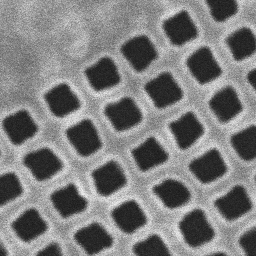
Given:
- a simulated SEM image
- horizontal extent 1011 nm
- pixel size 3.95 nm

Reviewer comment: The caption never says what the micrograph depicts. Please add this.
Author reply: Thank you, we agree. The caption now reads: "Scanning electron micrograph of a regular array of holes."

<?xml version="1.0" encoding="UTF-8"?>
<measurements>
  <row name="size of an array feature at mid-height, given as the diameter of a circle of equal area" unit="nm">128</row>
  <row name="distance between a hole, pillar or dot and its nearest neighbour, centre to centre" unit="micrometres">0.172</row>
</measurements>